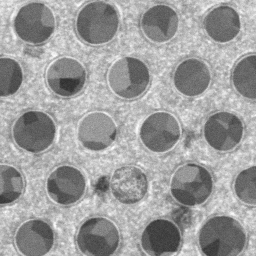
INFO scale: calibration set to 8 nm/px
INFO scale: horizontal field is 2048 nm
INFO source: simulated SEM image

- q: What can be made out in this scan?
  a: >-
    a regular array of raised bodies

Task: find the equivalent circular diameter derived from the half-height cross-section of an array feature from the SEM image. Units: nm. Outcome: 327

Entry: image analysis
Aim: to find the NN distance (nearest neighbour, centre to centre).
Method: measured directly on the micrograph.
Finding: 495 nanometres